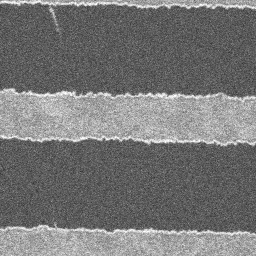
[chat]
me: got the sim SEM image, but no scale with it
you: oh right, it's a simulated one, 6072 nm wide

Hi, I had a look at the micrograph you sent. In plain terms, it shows one or a few lines or trenches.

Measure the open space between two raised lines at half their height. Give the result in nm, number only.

2160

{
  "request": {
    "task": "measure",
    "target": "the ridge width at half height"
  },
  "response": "1080 nanometers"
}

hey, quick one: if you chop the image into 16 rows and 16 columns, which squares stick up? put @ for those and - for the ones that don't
----------------
----------------
----------------
----------------
----------------
----------------
@@@@@@@@@@@@@@@@
@@@@@@@@@@@@@@@@
@@@@@@@@@@@@@@@@
----------------
----------------
----------------
----------------
----------------
@@@@@@@-@@------
@@@@@@@@@@@@@@@@